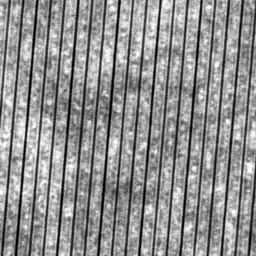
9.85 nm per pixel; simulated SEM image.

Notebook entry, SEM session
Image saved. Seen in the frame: parallel lines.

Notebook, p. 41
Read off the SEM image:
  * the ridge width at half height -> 0.108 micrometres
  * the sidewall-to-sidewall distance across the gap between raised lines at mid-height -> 2.98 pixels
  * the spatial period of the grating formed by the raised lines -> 135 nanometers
